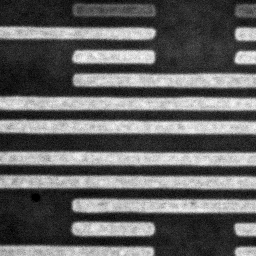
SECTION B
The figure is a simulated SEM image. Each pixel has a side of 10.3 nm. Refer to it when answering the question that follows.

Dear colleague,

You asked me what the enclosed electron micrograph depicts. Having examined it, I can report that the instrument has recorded wiring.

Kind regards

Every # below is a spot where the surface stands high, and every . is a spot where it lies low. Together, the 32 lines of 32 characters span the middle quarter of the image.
................................
................................
................................
...#############################
...#############################
...........................#####
................................
................................
................................
################################
################################
................................
................................
................................
###################.............
################################
################################
................................
................................
................................
................................
................................
################################
################################
################################
................................
................................
................................
################################
################################
################################
................................